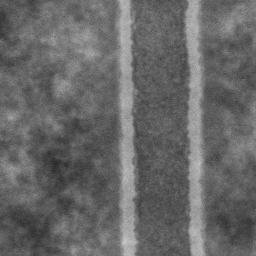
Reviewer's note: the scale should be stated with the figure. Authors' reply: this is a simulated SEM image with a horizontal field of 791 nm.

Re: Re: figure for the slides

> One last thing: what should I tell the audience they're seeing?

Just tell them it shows one or a few lines or trenches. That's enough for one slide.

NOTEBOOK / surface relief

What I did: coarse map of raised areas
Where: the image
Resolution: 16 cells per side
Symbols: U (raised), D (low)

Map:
UUUUUUUUDDDDUUUU
UUUUUUUUDDDDUUUU
UUUUUUUUDDDDUUUU
UUUUUUUUDDDDUUUU
UUUUUUUUDDDDUUUU
UUUUUUUUDDDDUUUU
UUUUUUUUDDDDUUUU
UUUUUUUUDDDDUUUU
UUUUUUUUDDDDUUUU
UUUUUUUUDDDDUUUU
UUUUUUUUDDDDUUUU
UUUUUUUUDDDDUUUU
UUUUUUUUDDDDUUUU
UUUUUUUUDDDDUUUU
UUUUUUUUDDDDUUUU
UUUUUUUUDDDDUUUU